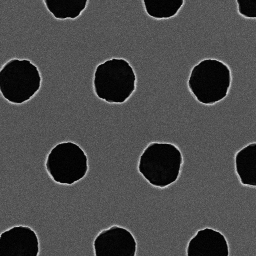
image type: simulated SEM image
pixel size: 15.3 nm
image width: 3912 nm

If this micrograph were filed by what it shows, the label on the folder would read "holes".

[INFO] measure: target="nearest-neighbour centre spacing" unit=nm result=1440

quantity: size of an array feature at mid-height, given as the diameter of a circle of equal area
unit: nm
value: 639